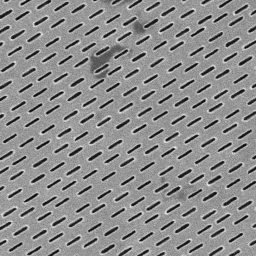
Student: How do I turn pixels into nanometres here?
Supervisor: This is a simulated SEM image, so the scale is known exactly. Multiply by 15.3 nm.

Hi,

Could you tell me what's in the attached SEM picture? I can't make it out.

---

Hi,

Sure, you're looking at a regular array of holes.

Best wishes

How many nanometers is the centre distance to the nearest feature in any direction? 242